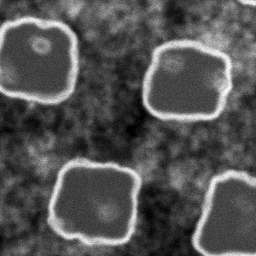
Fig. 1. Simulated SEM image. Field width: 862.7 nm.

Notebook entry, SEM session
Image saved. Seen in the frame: raised bodies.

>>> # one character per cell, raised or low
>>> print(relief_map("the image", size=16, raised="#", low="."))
................
.###............
#####...........
#####.....####..
#####....#####..
####.....#####..
.........#####..
................
................
................
....####........
....#####....###
...#####.....###
...#####.....###
....####....####
............####